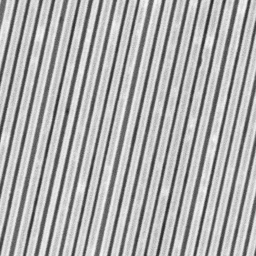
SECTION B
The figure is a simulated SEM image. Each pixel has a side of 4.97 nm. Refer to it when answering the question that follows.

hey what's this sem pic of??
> parallel lines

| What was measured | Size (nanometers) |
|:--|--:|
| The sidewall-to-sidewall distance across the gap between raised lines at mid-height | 24.3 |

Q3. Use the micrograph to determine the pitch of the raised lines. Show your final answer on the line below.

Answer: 12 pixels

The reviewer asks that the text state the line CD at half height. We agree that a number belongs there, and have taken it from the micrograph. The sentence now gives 34.6 nanometers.